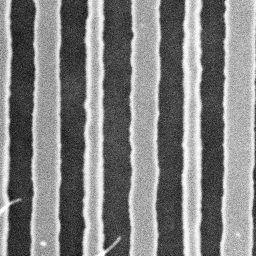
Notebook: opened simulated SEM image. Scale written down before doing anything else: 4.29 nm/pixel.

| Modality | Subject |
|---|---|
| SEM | lines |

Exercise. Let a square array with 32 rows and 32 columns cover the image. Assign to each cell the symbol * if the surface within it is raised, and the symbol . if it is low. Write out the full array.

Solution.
*...****...**....***...**...****
*...***....**....***...**...****
*...****...**....***...**...****
*...****...**....***...**...****
*...****...**....***...**...****
*...****...**....***...**...****
*...***....**....***...**...****
*...***....**...****...**...****
*...***....**....***...**...****
*...***....**....***...**...****
*...***....**...****...**...****
*...***....**...****...**...****
*...****...**...****...**...****
*...***....**...****...**...****
*...***....**....***...**...****
*...***....**...****...**...****
*...***....**...****...**...****
*...***....**...****...**...****
*...****...**....***...**...****
*...***....**...****...**...****
*...****...**...****...**...****
*...****...**....***...**...****
*...****...**...****...**...****
*...***....**...****...**...****
*...***....**...***....**...****
*...***....**...***....**...***.
*...***....**...***....**...***.
*...***....**...****...**...***.
*...***....**...****...**...****
*...***....**...****...**...***.
*...***...***...****...**...***.
*...***....**...****...**...***.